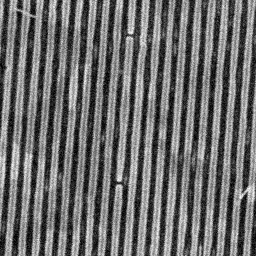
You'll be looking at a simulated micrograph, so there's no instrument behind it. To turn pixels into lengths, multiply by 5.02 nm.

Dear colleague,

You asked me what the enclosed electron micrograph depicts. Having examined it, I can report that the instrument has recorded parallel lines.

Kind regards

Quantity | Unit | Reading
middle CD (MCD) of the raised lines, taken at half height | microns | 0.0225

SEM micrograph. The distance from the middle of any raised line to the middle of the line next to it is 0.0662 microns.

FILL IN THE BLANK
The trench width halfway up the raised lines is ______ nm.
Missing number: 40